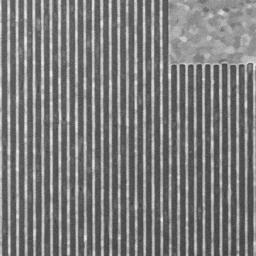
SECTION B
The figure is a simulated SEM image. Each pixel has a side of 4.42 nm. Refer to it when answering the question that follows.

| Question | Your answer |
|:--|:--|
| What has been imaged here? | parallel lines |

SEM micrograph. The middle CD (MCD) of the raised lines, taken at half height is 9.4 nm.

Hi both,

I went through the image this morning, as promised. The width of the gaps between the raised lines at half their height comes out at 28.2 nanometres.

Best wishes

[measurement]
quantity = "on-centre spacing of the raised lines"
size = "37.4 nanometres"